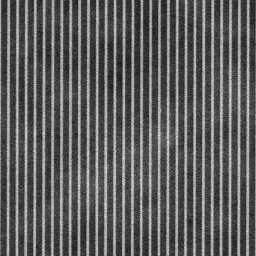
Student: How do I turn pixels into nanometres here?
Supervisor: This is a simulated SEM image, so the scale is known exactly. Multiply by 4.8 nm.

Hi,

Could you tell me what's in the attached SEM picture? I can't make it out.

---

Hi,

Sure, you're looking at parallel lines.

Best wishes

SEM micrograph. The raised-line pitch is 42.6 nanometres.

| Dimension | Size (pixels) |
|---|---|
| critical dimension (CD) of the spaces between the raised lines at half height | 7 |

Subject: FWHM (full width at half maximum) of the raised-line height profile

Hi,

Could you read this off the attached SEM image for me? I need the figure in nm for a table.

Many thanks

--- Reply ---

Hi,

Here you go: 9